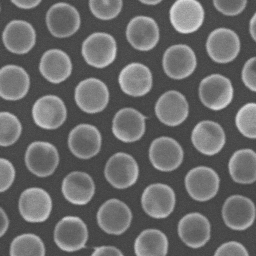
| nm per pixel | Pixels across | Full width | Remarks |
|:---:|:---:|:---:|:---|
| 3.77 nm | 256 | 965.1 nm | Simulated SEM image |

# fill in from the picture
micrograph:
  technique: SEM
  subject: a regular array of raised bodies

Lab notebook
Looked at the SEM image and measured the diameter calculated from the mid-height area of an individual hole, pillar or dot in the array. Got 0.125 um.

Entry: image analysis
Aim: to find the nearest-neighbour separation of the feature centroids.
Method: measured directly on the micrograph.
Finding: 174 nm